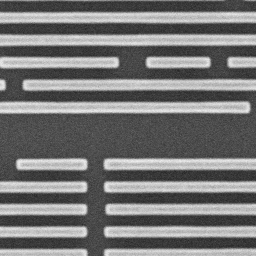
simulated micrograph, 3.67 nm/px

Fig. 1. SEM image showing groups of lines, slits or small figures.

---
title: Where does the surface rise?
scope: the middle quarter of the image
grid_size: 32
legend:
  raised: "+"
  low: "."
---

+++++++++++++........+++++++++++
................................
................................
................................
++++++++++++++++++++++++++++++++
++++++++++++++++++++++++++++++++
................................
................................
................................
................................
++++++++++++++++++++++++++++++++
++++++++++++++++++++++++++++++++
................................
................................
................................
................................
................................
................................
................................
................................
................................
................................
................................
................................
+++++.....++++++++++++++++++++++
+++++.....++++++++++++++++++++++
................................
................................
................................
................................
+++++.....++++++++++++++++++++++
+++++.....++++++++++++++++++++++